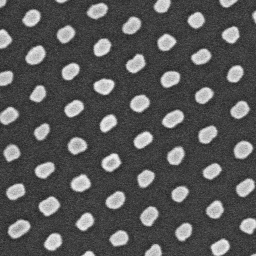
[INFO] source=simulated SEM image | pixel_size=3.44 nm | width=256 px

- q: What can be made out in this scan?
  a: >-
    a regular array of raised bodies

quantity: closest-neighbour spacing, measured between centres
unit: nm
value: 126